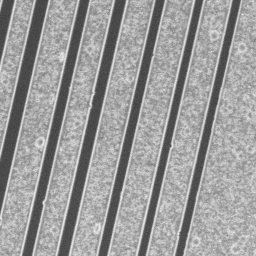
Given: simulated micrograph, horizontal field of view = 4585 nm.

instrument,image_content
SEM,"parallel lines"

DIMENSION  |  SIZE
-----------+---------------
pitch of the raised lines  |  673 nanometres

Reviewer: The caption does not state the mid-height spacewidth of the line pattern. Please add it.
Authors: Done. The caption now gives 190 nm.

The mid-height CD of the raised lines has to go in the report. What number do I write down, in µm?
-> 0.478